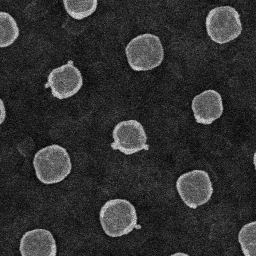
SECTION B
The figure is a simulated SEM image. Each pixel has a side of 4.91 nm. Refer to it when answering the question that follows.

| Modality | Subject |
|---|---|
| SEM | a regular array of raised bodies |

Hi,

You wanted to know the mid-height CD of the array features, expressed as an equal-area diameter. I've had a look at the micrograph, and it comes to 174 nanometers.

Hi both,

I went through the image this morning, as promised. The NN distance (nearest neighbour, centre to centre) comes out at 403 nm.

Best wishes